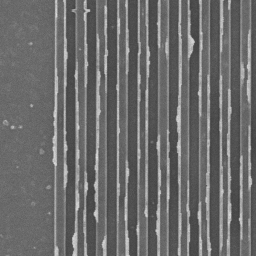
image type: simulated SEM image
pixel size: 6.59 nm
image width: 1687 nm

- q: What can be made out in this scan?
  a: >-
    parallel lines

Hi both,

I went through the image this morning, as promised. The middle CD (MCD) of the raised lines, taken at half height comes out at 68.4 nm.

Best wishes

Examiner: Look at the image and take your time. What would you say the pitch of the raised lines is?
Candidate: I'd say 0.136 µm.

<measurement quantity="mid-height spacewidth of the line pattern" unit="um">0.0626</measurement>